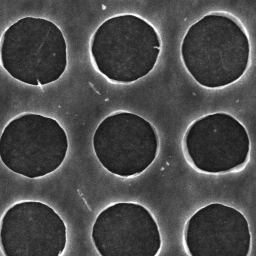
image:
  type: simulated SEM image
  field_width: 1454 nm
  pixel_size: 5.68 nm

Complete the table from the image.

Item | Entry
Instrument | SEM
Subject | holes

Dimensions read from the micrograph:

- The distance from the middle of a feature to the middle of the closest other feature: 517 nm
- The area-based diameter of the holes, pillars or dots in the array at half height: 372 nanometers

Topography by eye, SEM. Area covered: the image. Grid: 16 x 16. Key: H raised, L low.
HHHHHHHHHHHHHHHH
HLLHHHLLLHHHLLLH
LLLLHHLLLLHHLLLH
LLLLHHLLLLHLLLLL
HLLLHHLLLHHHLLLH
HHHHHHHHHHHHHHHH
HHHHHHHHHHHHHHHH
HLLHHHHLLHHHLLLH
LLLLHHLLLLHHLLLH
LLLLHHLLLLHHLLLH
HLLLHHHLLHHHLLLH
HHHHHHHHHHHHHHHH
HHHHHHHHHHHHHHHH
LLLLHHLLLHHHLLLH
LLLLHHLLLLHHLLLL
LLLLHHLLLLHHLLLL